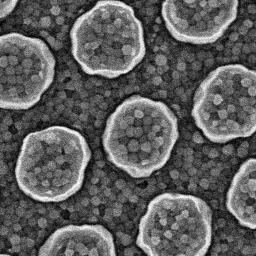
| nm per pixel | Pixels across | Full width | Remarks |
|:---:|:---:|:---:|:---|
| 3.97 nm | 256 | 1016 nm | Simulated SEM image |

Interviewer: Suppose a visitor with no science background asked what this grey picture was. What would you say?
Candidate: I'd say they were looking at raised bodies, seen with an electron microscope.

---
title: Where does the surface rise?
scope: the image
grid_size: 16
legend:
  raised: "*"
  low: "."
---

*.....**..*****.
.....****.****..
**...****...*...
***..****.......
***...**......**
***..........***
**......**..****
.......****.****
..***..****..**.
.****..****.....
.****...**.....*
.****..........*
..........**..**
.........****..*
....**...****...
...****..****...